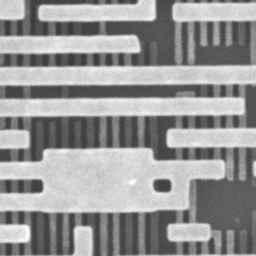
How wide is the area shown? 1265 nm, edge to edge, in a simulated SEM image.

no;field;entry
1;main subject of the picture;wiring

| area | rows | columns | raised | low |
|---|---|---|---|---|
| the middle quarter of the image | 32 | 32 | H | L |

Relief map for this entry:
LLLLLLLLLLLLLLLLLLLLLLLLLLLLLLLL
HHHHHHHHHHHHHHHHHHHHHHHHHHHHHHHH
HHHHHHHHHHHHHHHHHHHHHHHHHHHHHHHH
HHHHHHHHHHHHHHHHHHHHHHHHHHHHHHHH
HHHHHHHHHHHHHHHHHHHHHHHHHHHHHHHH
LLLLLLLLLLLLLLLLLLLLLLLLLLLLLLLL
LLLLLLLLLLLLLLLLLLLLLLLLLLLLLLLL
LLLLLLLLLLLLLLLLLLLLLLLLLLLLLLLL
LLLLLLLLLLLLLLLLLLLLLLLLLLLLLLLL
HHHHHHHHHHHHHHHHHHHHHHHHHHHHHHHH
HHHHHHHHHHHHHHHHHHHHHHHHHHHHHHHH
HHHHHHHHHHHHHHHHHHHHHHHHHHHHHHHH
HHHHHHHHHHHHHHHHHHHHHHHHHHHHHHHH
LLLLLLLLLLLLLLLLLLLLLLLLLLLLLLLL
LLLLLLLLLLLLLLLLLLLLLLLLLLLLLLLL
LLLLLLLLLLLLLLLLLLLLLLLLLLLLLLLL
LLLLLLLLLLLLLLLLLLLLLLLLLLHHHHHH
LLLLLLLLLLLLLLLLLLLLLLLLLLHHHHHH
LLLLLLLLLLLLLLLLLLLLLLLLLLHHHHHH
LLLLLLLLLLLLLLLLLLLLLLLLLLHHHHHH
LLLLLLLLLLLLLLLLLLLLLLLLLLHHHHHH
HHHHHHHHHHHHHHHHHHHHHHLLLLLLLLLL
HHHHHHHHHHHHHHHHHHHHHHLLLLLLLLLL
HHHHHHHHHHHHHHHHHHHHHHLLLLLLLLLL
HHHHHHHHHHHHHHHHHHHHHHHHHHHHHHHH
HHHHHHHHHHHHHHHHHHHHHHHHHHHHHHHH
HHHHHHHHHHHHHHHHHHHHHHHHHHHHHHHH
HHHHHHHHHHHHHHHHHHHHHHHHHHHHHHHH
HHHHHHHHHHHHHHHHHHHHHHHHHHHHHHHH
HHHHHHHHHHHHHHHHHHHHHHLLLLLHHHHL
HHHHHHHHHHHHHHHHHHHHHHLLLLLHHHHL
HHHHHHHHHHHHHHHHHHHHHHLLLLLHHHHL